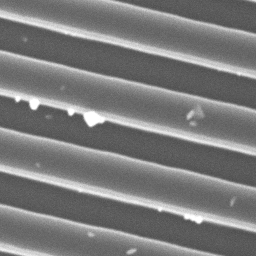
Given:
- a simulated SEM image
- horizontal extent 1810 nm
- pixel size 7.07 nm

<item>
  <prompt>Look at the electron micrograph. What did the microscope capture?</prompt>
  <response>lines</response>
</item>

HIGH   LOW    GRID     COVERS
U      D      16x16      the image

UUUUUUUUUDDDDDDD
DDUUUUUUUUUUUDDD
DDDDDDUUUUUUUUUU
UDDDDDDDDDUUUUUU
UUUUUDDDDDDDDDUU
UUUUUUUUUUDDDDDD
DDUUUUUUUUUUUUDD
DDDDDUUUUUUUUUUU
UUDDDDDDDDDUUUUU
UUUUUUUDDDDDDDDU
UUUUUUUUUUDDDDDD
DDDDUUUUUUUUUUUD
DDDDDDDDUUUUUUUU
UUUDDDDDDDDUUUUU
UUUUUUUDDDDDDDDD
UUUUUUUUUUUDDDDD